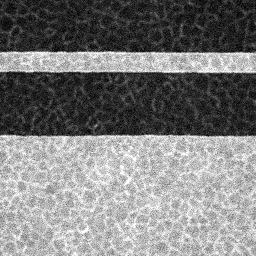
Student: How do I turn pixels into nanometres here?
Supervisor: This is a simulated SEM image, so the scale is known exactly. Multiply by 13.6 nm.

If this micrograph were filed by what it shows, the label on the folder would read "one or a few lines or trenches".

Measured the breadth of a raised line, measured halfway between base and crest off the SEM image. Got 0.258 µm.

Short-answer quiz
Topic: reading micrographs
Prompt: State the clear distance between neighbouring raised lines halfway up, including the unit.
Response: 876 nm